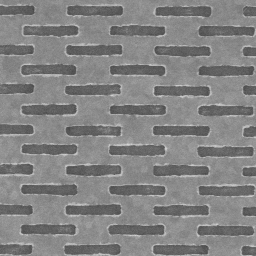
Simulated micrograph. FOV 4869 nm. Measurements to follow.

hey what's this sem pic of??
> a regular array of holes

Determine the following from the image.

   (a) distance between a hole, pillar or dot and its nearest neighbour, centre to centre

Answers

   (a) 39.6 px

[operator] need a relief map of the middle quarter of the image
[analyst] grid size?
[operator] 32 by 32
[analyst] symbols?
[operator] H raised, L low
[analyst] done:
LLLHHHHHHHHHLLLLLLLLLLLLLHHHHHHH
LLLHHHHHHHHLLLLLLLLLLLLLLLHHHHHH
LLLHHHHHHHHHLLLLLLLLLLLLLHHHHHHH
HHHHHHHHHHHHHHHHHHHHHHHHHHHHHHHH
HHHHHHHHHHHHHHHHHHHHHHHHHHHHHHHH
HLLLLLLLLLLLLLHHHHHHHHHLLHHLLLLL
LLLLLLLLLLLLLLHHHHHHHHLLLLLLLLLL
HLLLLLLLLLLLLLHHHHHHHHLLLLLLLLLL
HHHHHHHHHHHHHHHHHHHHHHHHHHHHHHHH
HHHHHHHHHHHHHHHHHHHHHHHHHHHHHHHH
LLLHHHHHHHHHLLLLLLLLLLLLLHHHHHHH
LLLHHHHHHHHLLLLLLLLLLLLLLLHHHHHH
LLLHHHHHHHHHLLLLLLLLLLLLLHHHHHHH
HHHHHHHHHHHHHHHHHHHHHHHHHHHHHHHH
HHHHHHHHHHHHHHHHHHHHHHHHHHHHHHHH
HHHLLLLLLLLLLLHHHHHHHHLLLLLLLLLL
LLLLLLLLLLLLLLHHHHHHHHLLLLLLLLLL
HLLLLLLLLLLLLLHHHHHHHHLLLLLLLLLL
HHHHHHHHHHHHHHHHHHHHHHHHHHHHHHHH
HHHHHHHHHHHHHHHHHHHHHHHHHHHHHHHH
LLLHHHHHHHHLLLLLLLLLLLLLLHHHHHHH
LLLHHHHHHHHLLLLLLLLLLLLLLHHHHHHH
LLLHHHHHHHHLLLLLLLLLLLLLLHHHHHHH
HHHHHHHHHHHHHHHHHHHHHHHHHHHHHHHH
HHHHHHHHHHHHHHHHHHHHHHHHHHHHHHHH
HLLLLLLLLLLLLLHHHHHHHHLLLLLLLLLL
LLLLLLLLLLLLLLLHHHHHHHLLLLLLLLLL
HLLLLLLLLLLLLLHHHHHHHHLLLLLLLLLL
HHHHHHHHHHHHHHHHHHHHHHHHHHHHHHHH
HHHHHHHHHHHHHHHHHHHHHHHHHHHHHHHH
LLLHHHHHHHHHLLLLLLLLLLLLLHHHHHHH
LLLHHHHHHHHLLLLLLLLLLLLLLHHHHHHH